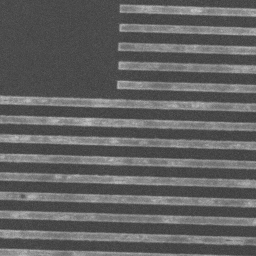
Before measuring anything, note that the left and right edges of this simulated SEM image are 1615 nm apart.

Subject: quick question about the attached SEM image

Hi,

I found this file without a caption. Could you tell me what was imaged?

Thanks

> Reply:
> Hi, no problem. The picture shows parallel lines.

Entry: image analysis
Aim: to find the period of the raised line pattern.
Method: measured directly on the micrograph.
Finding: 120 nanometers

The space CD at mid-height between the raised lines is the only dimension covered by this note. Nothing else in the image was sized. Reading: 74.9 nm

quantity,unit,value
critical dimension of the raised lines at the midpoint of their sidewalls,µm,0.0481